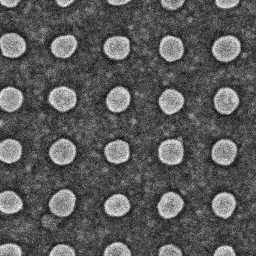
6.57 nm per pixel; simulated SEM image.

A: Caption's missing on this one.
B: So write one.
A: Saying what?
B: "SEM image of a regular array of raised bodies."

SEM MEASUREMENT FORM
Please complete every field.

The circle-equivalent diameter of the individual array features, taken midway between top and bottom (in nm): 158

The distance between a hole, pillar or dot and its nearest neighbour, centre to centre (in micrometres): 0.343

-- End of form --